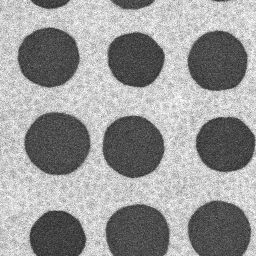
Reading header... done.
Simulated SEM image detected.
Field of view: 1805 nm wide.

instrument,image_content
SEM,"holes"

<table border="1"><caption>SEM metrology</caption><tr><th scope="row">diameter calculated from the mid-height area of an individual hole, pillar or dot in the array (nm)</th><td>426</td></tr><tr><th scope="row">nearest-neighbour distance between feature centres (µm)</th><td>0.579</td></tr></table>